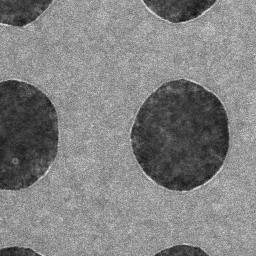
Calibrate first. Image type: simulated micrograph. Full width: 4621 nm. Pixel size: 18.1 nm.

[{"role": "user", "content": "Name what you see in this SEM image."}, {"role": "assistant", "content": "holes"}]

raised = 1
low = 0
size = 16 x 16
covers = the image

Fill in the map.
0001111110000111
0011111111111111
1111111111111111
1111111111111111
1111111111111111
0011111111000111
0001111110000011
0000111100000011
0000111100000011
0000111100000011
0001111110000011
0011111111000111
1111111111111111
1111111111111111
1111111111111111
0011111111101111